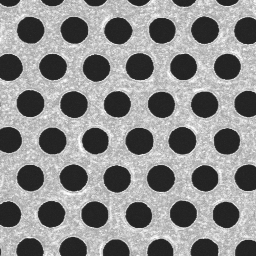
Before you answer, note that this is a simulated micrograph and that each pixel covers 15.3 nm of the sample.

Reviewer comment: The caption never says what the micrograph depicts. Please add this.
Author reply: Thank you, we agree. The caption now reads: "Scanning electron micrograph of a regular array of holes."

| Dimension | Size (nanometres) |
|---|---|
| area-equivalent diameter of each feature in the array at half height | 419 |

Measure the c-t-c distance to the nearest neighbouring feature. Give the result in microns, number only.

0.641